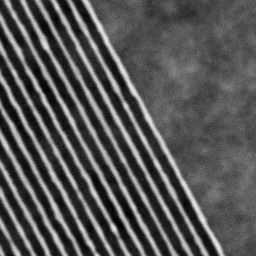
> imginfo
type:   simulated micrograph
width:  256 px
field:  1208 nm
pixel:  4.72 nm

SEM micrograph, parallel lines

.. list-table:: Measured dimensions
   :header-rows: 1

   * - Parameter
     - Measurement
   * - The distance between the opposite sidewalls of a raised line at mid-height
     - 18.7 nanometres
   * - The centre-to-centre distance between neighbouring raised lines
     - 13.8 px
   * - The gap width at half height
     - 46.7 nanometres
